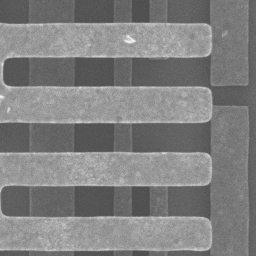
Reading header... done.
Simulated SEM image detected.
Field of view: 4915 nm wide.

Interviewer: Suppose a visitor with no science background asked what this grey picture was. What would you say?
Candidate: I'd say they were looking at wiring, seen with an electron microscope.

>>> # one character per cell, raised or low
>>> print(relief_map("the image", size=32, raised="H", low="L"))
LLLLLLLLLLLLLLLLLLLLLLLLLLLLLLLL
LLLLLLLLLLLLLLLLLLLLLLLLLLLLLLLL
LLLLLLLLLLLLLLLLLLLLLLLLLLLLLLLL
HHHHHHHHHHHHHHHHHHHHHHHHHHLLLLLL
HHHHHHHHHHHHHHHHHHHHHHHHHHLLLLLL
HHHHHHHHHHHHHHHHHHHHHHHHHHLLLLLL
HHHHHHHHHHHHHHHHHHHHHHHHHHLLLLLL
HLLLLLLLLLLLLLLLLLLLLLLLLLLLLLLL
LLLLLLLLLLLLLLLLLLLLLLLLLLLLLLLL
LLLLLLLLLLLLLLLLLLLLLLLLLLLLLLLL
HLLLLLLLLLLLLLLLLLLLLLLLLLLLLLLL
HHHHHHHHHHHHHHHHHHHHHHHHHHLLLLLL
HHHHHHHHHHHHHHHHHHHHHHHHHHLLLLLL
HHHHHHHHHHHHHHHHHHHHHHHHHHLLLLLL
HHHHHHHHHHHHHHHHHHHHHHHHHHLLLLLL
LLLLLLLLLLLLLLLLLLLLLLLLLLLLLLLL
LLLLLLLLLLLLLLLLLLLLLLLLLLLLLLLL
LLLLLLLLLLLLLLLLLLLLLLLLLLLLLLLL
LLLLLLLLLLLLLLLLLLLLLLLLLLLLLLLL
HHHHHHHHHHHHHHHHHHHHHHHHHHLLLLLL
HHHHHHHHHHHHHHHHHHHHHHHHHHLLLLLL
HHHHHHHHHHHHHHHHHHHHHHHHHHLLLLLL
HHHHHHHHHHHHHHHHHHHHHHHHHHLLLLLL
LLLLLLLLLLLLLLLLLLLLLLLLLLLLLLLL
LLLLLLLLLLLLLLLLLLLLLLLLLLLLLLLL
LLLLLLLLLLLLLLLLLLLLLLLLLLLLLLLL
LLLLLLLLLLLLLLLLLLLLLLLLLLLLLLLL
HHHHHHHHHHHHHHHHHHHHHHHHHHLLLLLL
HHHHHHHHHHHHHHHHHHHHHHHHHHLLLLLL
HHHHHHHHHHHHHHHHHHHHHHHHHHLLLLLL
HHHHHHHHHHHHHHHHHHHHHHHHHHLLLLLL
LLLLLLLLLLLLLLLLLLLLLLLLLLLLLLLL